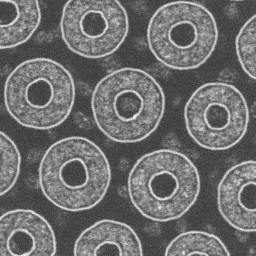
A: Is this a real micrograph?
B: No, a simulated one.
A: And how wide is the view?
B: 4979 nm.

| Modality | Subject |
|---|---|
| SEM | ring-shaped raised bodies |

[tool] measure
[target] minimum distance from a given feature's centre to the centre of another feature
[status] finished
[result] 1700 nm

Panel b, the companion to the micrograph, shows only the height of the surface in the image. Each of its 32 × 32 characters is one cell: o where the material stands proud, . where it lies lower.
..ooo...ooooooo......ooo........
..ooo...ooo.oooo....oooooo......
..ooo...oo...ooo...oooooooo....o
oooo....oo...ooo...ooo..ooo...oo
oooo....ooo.oooo...oo....oo...oo
oo......ooooooo....ooo..ooo...oo
.........ooooo.....ooooooo....oo
....oo..............oooooo....oo
..oooooo..............oo......oo
.oooooooo.....ooooo............o
.ooo..ooo...oooooooo......oo....
.oo....oo...ooo..ooo....oooooo..
.oo...ooo...oo....oo....oooooo..
.oooooooo...oo....oo...ooo..ooo.
..oooooo....ooo..ooo...ooo...oo.
...oooo.....oooooooo...ooo..ooo.
.............oooooo.....ooooooo.
o.......ooo....oo.......oooooo..
oo....oooooo..............oo....
oo....ooooooo.....ooooo.........
oo...ooo..ooo....ooooooo......oo
oo...ooo...ooo..ooooooooo....ooo
oo...ooo...ooo..ooo...ooo...oooo
o....oooooooo...ooo...ooo..ooo..
......ooooooo...ooo..oooo..ooo..
.......ooooo.....ooooooo...ooo..
.ooo..............ooooo.....oooo
ooooo...............o.......oooo
oooooo.....ooooo..............oo
o...ooo...ooooooo.....ooooo.....
o...ooo..oooo.ooo....ooooooo....
o...ooo..ooo...ooo...ooooooo....